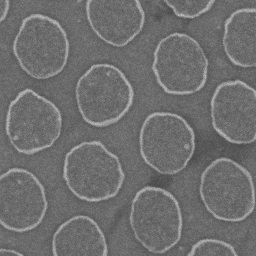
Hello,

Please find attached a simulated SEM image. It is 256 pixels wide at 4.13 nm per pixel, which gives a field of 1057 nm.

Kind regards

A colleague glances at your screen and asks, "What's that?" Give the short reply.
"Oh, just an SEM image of a regular array of raised bodies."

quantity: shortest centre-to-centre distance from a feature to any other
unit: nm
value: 319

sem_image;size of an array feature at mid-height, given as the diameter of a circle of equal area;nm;235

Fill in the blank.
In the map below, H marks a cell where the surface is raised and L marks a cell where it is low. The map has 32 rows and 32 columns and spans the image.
HLLLLLLLLLLHHHHHHLLLLHHHHHLLLLLL
HLLLLLLLLLLHHHHHHHLLLLHHHLLLLLHH
LLLHHHHLLLLHHHHHHHLLLLLLLLLLLHHH
LLLHHHHHLLLLHHHHHHLLLLLLLLLLHHHH
LLHHHHHHLLLLHHHHHLLLLHHLLLLLHHHH
LLHHHHHHLLLLLLHHLLLLHHHHHLLLHHHH
LLHHHHHHLLLLLLLLLLLLHHHHHLLLHHHH
LLHHHHHHLLLLLLLLLLLHHHHHHHLLLHHH
LLLHHHHHLLLHHHLLLLLHHHHHHHLLLLLL
LLLLHHLLLLHHHHHLLLLLHHHHHHLLLLLL
LLLLLLLLLLHHHHHHLLLLHHHHHLLLHHHL
LLLHLLLLLLHHHHHHLLLLLHHHLLLHHHHH
LLHHHHLLLLHHHHHHLLLLLLLLLLLHHHHH
LHHHHHHLLLHHHHHHLLLLLLLLLLHHHHHH
LHHHHHHHLLHHHHHLLLLHHHLLLLLHHHHH
LHHHHHHHLLLLHLLLLLHHHHHLLLLHHHHH
LHHHHHHLLLLLLLLLLLHHHHHHLLLHHHHH
LHHHHHHLLLLLLLLLLLHHHHHHLLLLLHHH
LLHHHLLLLHHHHLLLLLHHHHHHLLLLLLLL
LLLLLLLLHHHHHHLLLLHHHHHHLLLLLLLL
LLLLLLLLHHHHHHHLLLLHHHHLLLLHHLLL
LHHLLLLLHHHHHHHLLLLLHHLLLLHHHHHL
HHHHHLLLHHHHHHHLLLLLLLLLLHHHHHHL
HHHHHLLLLHHHHHHLLLLLLLLLLHHHHHHH
HHHHHLLLLLHHHHLLLHHHHLLLLHHHHHHH
HHHHHHLLLLLLLLLLLHHHHHLLLLHHHHHH
HHHHHLLLLLLLLLLLHHHHHHLLLLHHHHHL
HHHHHLLLLHHHLLLLHHHHHHHLLLLLLHLL
LHHHLLLLHHHHLLLLLHHHHHHLLLLLLLLL
LLLLLLLHHHHHHLLLLHHHHHHLLLLLLLLL
LLLLLLLHHHHHHLLLLLHHHHLLLHHHLLLL
HHLLLLLHHHHHHLLLLLLHLLLLHHHHHLLL